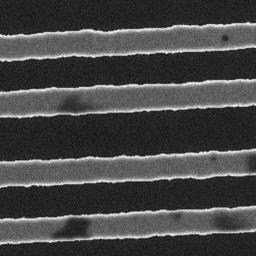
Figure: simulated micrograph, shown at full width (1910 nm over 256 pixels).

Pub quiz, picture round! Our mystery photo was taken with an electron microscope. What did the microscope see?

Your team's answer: lines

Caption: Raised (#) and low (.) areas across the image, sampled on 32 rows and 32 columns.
................................
................................
................................
....................############
################################
################################
#######################.........
###.............................
................................
................................
......................##########
.###############################
################################
##########################......
####............................
................................
................................
................................
................................
...................#############
################################
################################
###################.............
................................
................................
................................
..................##############
################################
################################
###################.............
................................
................................